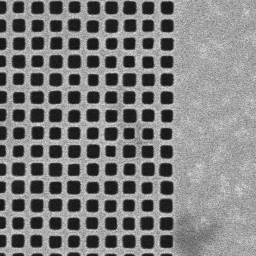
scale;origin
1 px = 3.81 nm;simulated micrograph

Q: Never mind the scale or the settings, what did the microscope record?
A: a regular array of holes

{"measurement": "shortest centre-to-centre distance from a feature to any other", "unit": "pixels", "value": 17.6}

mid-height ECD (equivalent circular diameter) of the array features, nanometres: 51.2